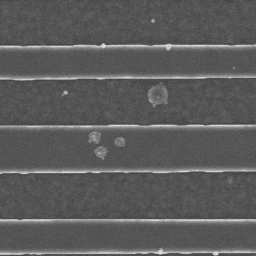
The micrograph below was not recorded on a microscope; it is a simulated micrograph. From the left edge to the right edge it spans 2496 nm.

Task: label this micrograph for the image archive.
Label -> lines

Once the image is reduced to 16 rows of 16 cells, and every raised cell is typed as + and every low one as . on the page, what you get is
................
................
................
++++++++++++++++
++++++++++++++++
................
................
................
++++++++++++++++
++++++++++++++++
++++++++++++++++
................
................
................
++++++++++++++++
++++++++++++++++